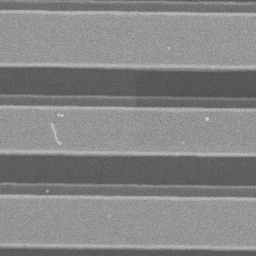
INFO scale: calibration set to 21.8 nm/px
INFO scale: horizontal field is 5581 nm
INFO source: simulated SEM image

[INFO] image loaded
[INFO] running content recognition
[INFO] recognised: lines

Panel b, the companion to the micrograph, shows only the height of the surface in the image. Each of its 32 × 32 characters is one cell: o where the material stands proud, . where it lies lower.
................................
oooooooooooooooooo..............
oooooooooooooooooooooooooooooooo
oooooooooooooooooooooooooooooooo
oooooooooooooooooooooooooooooooo
oooooooooooooooooooooooooooooooo
oooooooooooooooooooooooooooooooo
oooooooooooooooooooooooooooooooo
........................oooooooo
................................
................................
................................
................................
oooooooooooooooooooooooooo......
oooooooooooooooooooooooooooooooo
oooooooooooooooooooooooooooooooo
oooooooooooooooooooooooooooooooo
oooooooooooooooooooooooooooooooo
oooooooooooooooooooooooooooooooo
...............................o
................................
................................
................................
................................
oooooooooooooooo................
oooooooooooooooooooooooooooooooo
oooooooooooooooooooooooooooooooo
oooooooooooooooooooooooooooooooo
oooooooooooooooooooooooooooooooo
oooooooooooooooooooooooooooooooo
oooooooooooooooooooooooooooooooo
................................